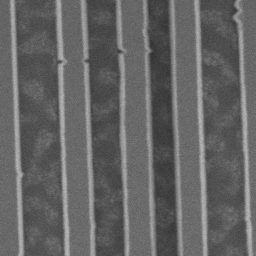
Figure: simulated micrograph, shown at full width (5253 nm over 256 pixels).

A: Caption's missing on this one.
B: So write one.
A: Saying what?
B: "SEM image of one or a few lines or trenches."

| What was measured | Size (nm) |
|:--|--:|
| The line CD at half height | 548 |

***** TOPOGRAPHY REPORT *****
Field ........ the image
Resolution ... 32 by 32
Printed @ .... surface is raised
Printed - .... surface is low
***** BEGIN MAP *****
@@-----@@@-----@@@---@@@@----@@@
@@-----@@@@----@@@---@@@@-----@@
@@-----@@@@----@@@---@@@@-----@@
@@-----@@@@----@@@---@@@@-----@@
@@------@@@----@@@----@@@-----@@
@@------@@@----@@@----@@@-----@@
@@------@@@----@@@@---@@@-----@@
@@------@@@----@@@----@@@-----@@
@@------@@@----@@@----@@@-----@@
@@------@@@----@@@----@@@-----@@
@@------@@@----@@@@---@@@-----@@
@@------@@@----@@@@---@@@-----@@
@@------@@@----@@@@---@@@-----@@
@@------@@@----@@@@---@@@-----@@
@@------@@@----@@@@---@@@------@
@@------@@@----@@@@---@@@------@
@@------@@@----@@@@---@@@------@
@@------@@@----@@@@---@@@------@
@@------@@@----@@@@---@@@------@
@@------@@@----@@@@---@@@------@
@@------@@@----@@@@---@@@------@
@@------@@@----@@@@---@@@------@
@@------@@@----@@@@---@@@------@
@@------@@@-----@@@---@@@------@
@@------@@@-----@@@---@@@------@
@@------@@@@----@@@---@@@@-----@
@@------@@@-----@@@---@@@@-----@
@@@-----@@@@----@@@---@@@------@
@@@-----@@@@----@@@---@@@@-----@
@@@-----@@@@----@@@---@@@@-----@
@@@-----@@@@----@@@---@@@@-----@
@@@-----@@@@----@@@----@@@-----@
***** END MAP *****